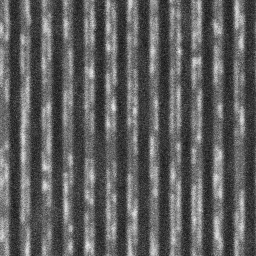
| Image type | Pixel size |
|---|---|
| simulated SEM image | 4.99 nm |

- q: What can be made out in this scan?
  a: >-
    parallel lines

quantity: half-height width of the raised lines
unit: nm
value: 39.9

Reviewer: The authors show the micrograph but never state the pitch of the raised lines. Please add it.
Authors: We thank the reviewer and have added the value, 107 nm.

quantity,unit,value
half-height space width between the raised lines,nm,66.8